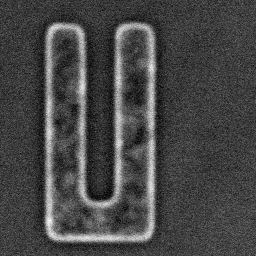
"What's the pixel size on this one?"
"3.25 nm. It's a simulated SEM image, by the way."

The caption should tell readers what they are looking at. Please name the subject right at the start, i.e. groups of lines, slits or small figures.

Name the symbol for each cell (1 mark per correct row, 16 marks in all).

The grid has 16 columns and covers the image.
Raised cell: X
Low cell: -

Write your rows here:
----------------
----------------
---XX--XXX------
---XX--XXX------
---XX--XXX------
---XX--XXX------
---XX--XXX------
---XX--XXX------
---XX--XXX------
---XX--XXX------
---XX--XXX------
---XX--XXX------
---XXX-XXX------
---XXXXXXX------
---XXXXXX-------
----------------